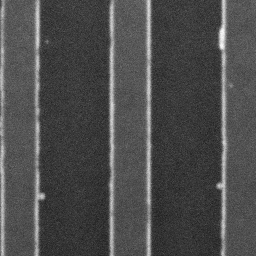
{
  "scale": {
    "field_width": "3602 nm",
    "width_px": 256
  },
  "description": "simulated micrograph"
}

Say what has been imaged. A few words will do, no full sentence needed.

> lines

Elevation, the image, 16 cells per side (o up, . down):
oo.....oo.....oo
oo.....oo.....oo
oo.....oo.....oo
oo.....oo.....oo
oo.....oo.....oo
oo.....oo.....oo
oo.....oo.....oo
oo.....oo.....oo
oo.....oo.....oo
oo.....oo.....oo
oo.....oo.....oo
oo.....oo.....oo
oo.....oo.....oo
oo.....oo.....oo
oo.....oo.....oo
oo.....oo.....oo